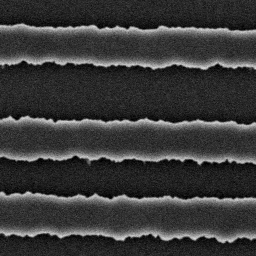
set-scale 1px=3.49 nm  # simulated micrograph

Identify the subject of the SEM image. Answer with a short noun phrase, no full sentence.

lines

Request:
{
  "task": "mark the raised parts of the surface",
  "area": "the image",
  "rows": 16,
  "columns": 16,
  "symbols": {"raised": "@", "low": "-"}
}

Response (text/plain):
----------------
----------------
@@@@@@@@@@@@@@@@
@@@@@@@@@@@@@@@@
----------------
----------------
----------------
@@@-------------
@@@@@@@@@@@@@@@@
@@@@@@@@@@@@@@@@
----------------
----------------
@@@@@@@@@@@@@@@@
@@@@@@@@@@@@@@@@
@@@@@@@@@@@@@@@@
----------------